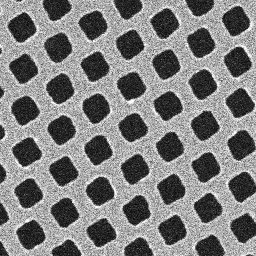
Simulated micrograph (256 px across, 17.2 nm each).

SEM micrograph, a regular array of holes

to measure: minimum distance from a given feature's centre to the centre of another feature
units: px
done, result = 41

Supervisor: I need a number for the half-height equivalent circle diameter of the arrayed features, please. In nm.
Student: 484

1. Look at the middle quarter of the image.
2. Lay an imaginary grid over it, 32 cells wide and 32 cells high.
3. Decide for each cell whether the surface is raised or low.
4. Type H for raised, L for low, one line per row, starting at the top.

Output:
HHHHLLLLLLLHHHHHHHHHHHLLLLLLLHHH
HHHHHLLLLLLHHHHHHHHHHHHLLLLLLHHH
LHHHHLLLLLLHHHHHLLLHHHHLLLLLHHHH
LHHHHHLLLLHHHHLLLLLHHHHHLLLHHHHL
LLHHHHHLHHHHHLLLLLLLHHHHHHHHHHHL
LLHHHHHHHHHHHLLLLLLLHHHHHHHHHHHL
LLLHHHHHHHHHHHLLLLLLLHHHHHHHHHHH
LLHHHHHHLHHHHHLLLLLLHHHHHLLLHHHH
LLHHHHLLLLHHHHHLLLLHHHHLLLLLLHHH
HHHHHLLLLLLHHHHHHHHHHHLLLLLLLHHH
HHHHLLLLLLLHHHHHHHHHHHLLLLLLLLHH
HHHHHLLLLLLLHHHHHHHHHHHLLLLLLLHH
HHHHHLLLLLLHHHHHHLLHHHHLLLLLLHHH
LHHHHHLLLLHHHHHLLLLLHHHHLLLHHHHH
LLHHHHHLLHHHHHLLLLLLHHHHHHHHHHHH
LLLHHHHHHHHHHLLLLLLLLHHHHHHHHHHH
LLLHHHHHHHHHHHLLLLLLLHHHHHHHHHHH
LLLHHHHHHHHHHHLLLLLLLHHHHLLLHHHH
LLHHHHHLLLLHHHHLLLLHHHHHLLLLLHHH
LHHHHHLLLLLHHHHHLHHHHHHLLLLLLHHH
HHHHHLLLLLLLHHHHHHHHHHHLLLLLLLHH
HHHHHLLLLLLLHHHHHHHHHHHLLLLLLLHH
HHHHHLLLLLLLHHHHHHLHHHHHLLLLLLHH
LHHHHHLLLLLHHHHHLLLLHHHHLLLLHHHH
LLHHHHHLLLHHHHHLLLLLHHHHHHLHHHHH
LLLHHHHHHHHHHHLLLLLLLHHHHHHHHHHH
LLLHHHHHHHHHHHLLLLLLLHHHHHHHHHHH
LLLLHHHHHHHHHHHLLLLLLHHHHHHLHHHH
LLLHHHHHLLLHHHHLLLLLHHHHHLLLLHHH
LLHHHHHLLLLHHHHHLLLHHHHHLLLLLHHH
HHHHHHLLLLLLHHHHHHHHHHHLLLLLLLHH
HHHHHLLLLLLLLHHHHHHHHHHLLLLLLLHH